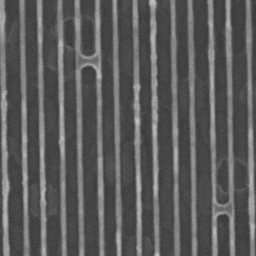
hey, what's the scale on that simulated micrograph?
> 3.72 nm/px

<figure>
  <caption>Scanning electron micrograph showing parallel lines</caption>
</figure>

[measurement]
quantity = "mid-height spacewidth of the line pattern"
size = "55.4 nanometres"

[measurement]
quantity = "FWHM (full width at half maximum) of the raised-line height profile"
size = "14.9 nanometers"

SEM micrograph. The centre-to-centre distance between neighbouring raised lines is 70.5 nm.